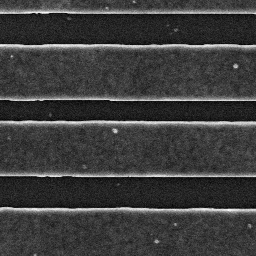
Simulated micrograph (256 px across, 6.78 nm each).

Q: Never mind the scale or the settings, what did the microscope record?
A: lines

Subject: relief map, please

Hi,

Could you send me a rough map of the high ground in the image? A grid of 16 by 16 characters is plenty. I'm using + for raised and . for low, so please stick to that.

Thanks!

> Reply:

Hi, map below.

++++++++++++++++
................
................
++++++++++++++++
++++++++++++++++
++++++++++++++++
................
................
++++++++++++++++
++++++++++++++++
++++++++++++++++
................
................
++++++++++++++++
++++++++++++++++
++++++++++++++++